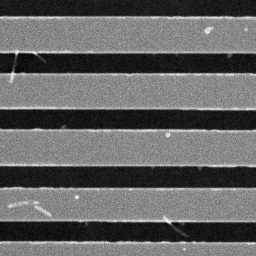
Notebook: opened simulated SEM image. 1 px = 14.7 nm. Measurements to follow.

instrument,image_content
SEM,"lines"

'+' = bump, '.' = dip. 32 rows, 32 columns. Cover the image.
................................
................................
++++++++++++++++++++++++++++++++
++++++++++++++++++++++++++++++++
++++++++++++++++++++++++++++++++
++++++++++++++++++++++++++++++++
++++++++++++++++++++++++++++++++
................................
................................
++++++++++++++++++++++++++++++++
++++++++++++++++++++++++++++++++
++++++++++++++++++++++++++++++++
++++++++++++++++++++++++++++++++
++++++++++++++++++++++++++++++++
................................
................................
++++++++++++++++++++++++++++++++
++++++++++++++++++++++++++++++++
++++++++++++++++++++++++++++++++
++++++++++++++++++++++++++++++++
++++++++++++++++++++++++++++++++
................................
................................
+++..++++.......................
++++++++++++++++++++++++++++++++
++++++++++++++++++++++++++++++++
++++++++++++++++++++++++++++++++
++++++++++++++++++++++++++++++++
................................
................................
++++++++++++++++++++++++++++++++
++++++++++++++++++++++++++++++++